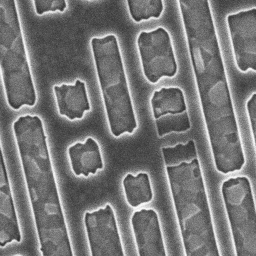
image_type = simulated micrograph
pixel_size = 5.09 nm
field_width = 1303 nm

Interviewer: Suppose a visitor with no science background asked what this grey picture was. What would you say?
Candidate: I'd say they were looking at parallel lines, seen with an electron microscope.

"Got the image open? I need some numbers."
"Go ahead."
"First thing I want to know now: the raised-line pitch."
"236 nm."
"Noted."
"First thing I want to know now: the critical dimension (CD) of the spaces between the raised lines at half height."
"143 nm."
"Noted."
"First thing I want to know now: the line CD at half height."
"90.5 nanometers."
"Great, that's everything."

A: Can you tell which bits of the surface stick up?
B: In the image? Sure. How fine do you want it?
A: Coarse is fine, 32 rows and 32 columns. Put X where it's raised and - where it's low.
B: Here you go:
--XX----XXXXXXXX----XX----XXXXXX
--XXX-XXXXXXXXXX----XXX---XXXX--
--XXXXXXXXXXXXXXX-XXXXX----X----
---XXXXXXXXXXXXXXXXXXXX----XX---
---XXXXXXXXXX-XXX----XX----XX---
---XXXXXXXX----XX----XXX---XX---
---XXXXXXXXX---XX-----XX----X---
---XXXXXXXXX---XXX----XXX---X---
----XXXXXXXX---XXX----XX----XX--
----XXXXXXXX----XX----XX----XXXX
----XXXXX-XX----XXXXXXXXX---XXXX
X---XXX----XX---XXXX---XX--XXXXX
X---XXX----XX---XXX----XX----XX-
XXXXXXX----XX----XX----XX----XX-
XXX-XXXX--XXX----XX-XXXXX----XX-
XX---XXXXXXXXX---XXXXXXXXX----X-
XX---XXXXXXXXX--XXXXXXXXXX----XX
XX----XXXXX-XXXXXXXXXXXXXX----XX
XX----XXX---XXXXXXXXXXXXXX----XX
XXX---XXX----XXXXXXXXXXXXXX---XX
XXX---XXX----XXXXXXXXX---XX---XX
XXX----XX---XXXXXXXXX----XXX-XXX
-XX----XXXXXXXX----XX----XXX---X
-XX----XXXXXXXXX---XX-----XX---X
-XXX---XXXXXXXXX---XXX----XX-X--
--XX----XXXXXXXX--XXXX----XX----
--XX----XXXX--XXX--XXX----XX----
--XX----XXX---XX----XX----XXX---
--XXX---XXX----XX---XX-----XX---
---XX----XX----XX---XXX----XX---
-XXXX----XX----XX---XXX----XX---
XXXXX----XX----XX----XX----XX---